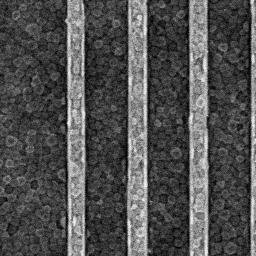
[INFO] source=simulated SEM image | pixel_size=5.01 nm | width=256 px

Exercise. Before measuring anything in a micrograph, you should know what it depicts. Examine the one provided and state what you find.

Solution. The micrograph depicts one or a few lines or trenches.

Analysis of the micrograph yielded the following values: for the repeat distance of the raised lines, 306 nanometers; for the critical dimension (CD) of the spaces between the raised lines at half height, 218 nm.